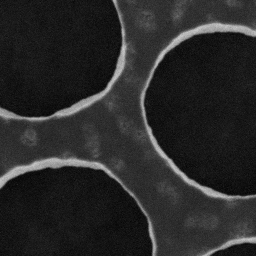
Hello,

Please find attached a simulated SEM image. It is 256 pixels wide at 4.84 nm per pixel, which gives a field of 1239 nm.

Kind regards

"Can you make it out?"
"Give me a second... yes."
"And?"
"holes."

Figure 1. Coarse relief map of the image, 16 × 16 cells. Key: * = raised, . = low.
.......*********
........********
........***.....
........**......
.......***......
.......**.......
.....****.......
*********.......
**********......
**********......
**....*****.....
........****....
........********
.........*******
.........*******
..........****..